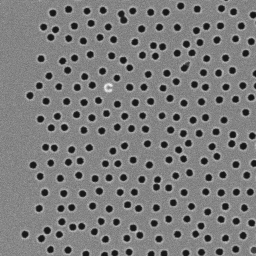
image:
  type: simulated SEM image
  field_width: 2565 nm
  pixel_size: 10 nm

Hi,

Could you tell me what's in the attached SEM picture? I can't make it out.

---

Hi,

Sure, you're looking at a regular array of holes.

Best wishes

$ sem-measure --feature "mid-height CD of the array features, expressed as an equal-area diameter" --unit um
0.0715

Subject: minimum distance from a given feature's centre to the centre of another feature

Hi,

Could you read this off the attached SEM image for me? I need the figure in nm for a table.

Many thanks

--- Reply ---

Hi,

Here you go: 137